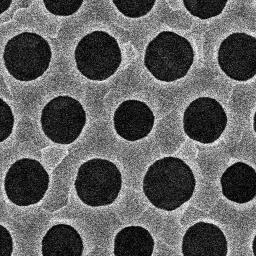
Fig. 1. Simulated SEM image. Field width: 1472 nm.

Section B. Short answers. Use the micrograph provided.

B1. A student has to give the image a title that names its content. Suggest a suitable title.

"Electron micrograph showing a regular array of holes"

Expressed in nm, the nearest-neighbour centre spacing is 408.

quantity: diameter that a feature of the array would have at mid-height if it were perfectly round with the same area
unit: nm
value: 277